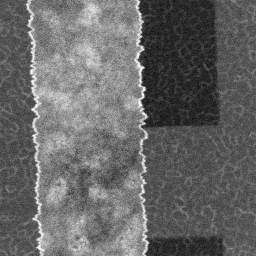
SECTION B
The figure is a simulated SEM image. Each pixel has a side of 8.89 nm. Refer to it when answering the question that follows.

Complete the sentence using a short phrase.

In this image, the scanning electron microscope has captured one or a few lines or trenches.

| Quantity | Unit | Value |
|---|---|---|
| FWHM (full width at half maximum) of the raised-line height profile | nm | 928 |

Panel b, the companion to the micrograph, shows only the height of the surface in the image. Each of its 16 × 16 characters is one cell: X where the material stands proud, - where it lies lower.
--XXXXXXX-------
--XXXXXXX-------
--XXXXXXX-------
--XXXXXXX-------
--XXXXXXX-------
--XXXXXXX-------
--XXXXXXX-------
--XXXXXXX-------
--XXXXXXX-------
--XXXXXXX-------
--XXXXXXX-------
--XXXXXXX-------
--XXXXXXX-------
--XXXXXXX-------
---XXXXXX-------
--XXXXXXX-------